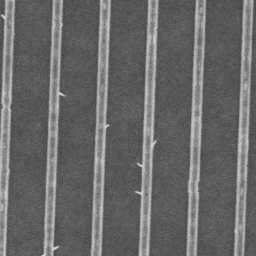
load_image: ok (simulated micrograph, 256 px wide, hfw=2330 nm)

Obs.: parallel lines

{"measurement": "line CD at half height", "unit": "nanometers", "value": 77.3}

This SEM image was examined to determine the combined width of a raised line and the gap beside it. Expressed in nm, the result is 434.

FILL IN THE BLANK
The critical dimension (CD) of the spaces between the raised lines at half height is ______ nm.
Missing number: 358